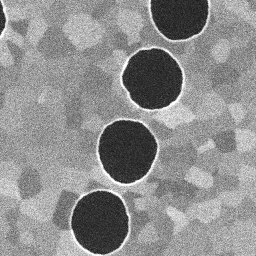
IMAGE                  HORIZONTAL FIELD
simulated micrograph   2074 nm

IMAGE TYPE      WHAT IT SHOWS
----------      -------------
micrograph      holes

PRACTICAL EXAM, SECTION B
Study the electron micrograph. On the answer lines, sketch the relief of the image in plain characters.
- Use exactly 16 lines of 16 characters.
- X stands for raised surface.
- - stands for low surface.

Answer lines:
XXXXXXXXX----XXX
XXXXXXXXXX---XXX
XXXXXXXXXXXXXXXX
XXXXXXXX---XXXXX
XXXXXXXX---XXXXX
XXXXXXXX---XXXXX
XXXXXXXXX--XXXXX
XXXXXXXXXXXXXXXX
XXXXXX----XXXXXX
XXXXXX----XXXXXX
XXXXXX---XXXXXXX
XXXXXXXXXXXXXXXX
XXXXX---XXXXXXXX
XXXX----XXXXXXXX
XXXXX---XXXXXXXX
XXXXX--XXXXXXXXX